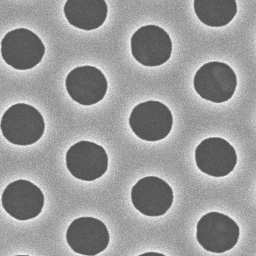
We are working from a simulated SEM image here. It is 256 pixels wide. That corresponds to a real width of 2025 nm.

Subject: a regular array of holes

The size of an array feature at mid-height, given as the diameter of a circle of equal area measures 330 nanometers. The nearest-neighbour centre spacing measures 585 nm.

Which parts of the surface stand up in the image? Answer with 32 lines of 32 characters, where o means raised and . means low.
oooooooo.....ooooooooooo......oo
oooooooo.....ooooooooooo......oo
oooooooo.....oooooooooooo....ooo
oo.ooooooo..ooooo...oooooooooooo
o....oooooooooooo....ooooooooooo
.....ooooooooooo......oooooooooo
......oooooooooo.....ooooooooooo
.....oooooooooooo....ooooooooooo
oo..ooooo...ooooooooooooo....ooo
oooooooo.....ooooooooooo......oo
oooooooo.....ooooooooooo......oo
oooooooo.....oooooooooooo....ooo
ooooooooo....ooooooooooooo...ooo
o...ooooooooooooo....ooooooooooo
.....ooooooooooo......oooooooooo
......oooooooooo......oooooooooo
......ooooooooooo....ooooooooooo
o....ooooooooooooo..ooooo...oooo
ooooooooo....oooooooooooo....ooo
oooooooo.....ooooooooooo......oo
oooooooo......ooooooooooo.....oo
ooooooooo....oooooooooooo....ooo
oo.ooooooo..ooooo...oooooooooooo
o....oooooooooooo....ooooooooooo
.....ooooooooooo......oooooooooo
.....oooooooooooo....ooooooooooo
o....oooooooooooo....ooooooooooo
oo.oooooo...ooooooooooooo....ooo
oooooooo.....oooooooooooo.....oo
oooooooo......ooooooooooo.....oo
ooooooooo.....ooooooooooo....ooo
ooooooooo....ooooooooooooo..oooo